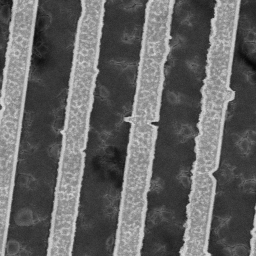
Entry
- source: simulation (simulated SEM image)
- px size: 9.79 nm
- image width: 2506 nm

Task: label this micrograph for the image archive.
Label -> one or a few lines or trenches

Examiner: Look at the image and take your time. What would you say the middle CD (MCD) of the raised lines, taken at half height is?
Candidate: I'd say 22.2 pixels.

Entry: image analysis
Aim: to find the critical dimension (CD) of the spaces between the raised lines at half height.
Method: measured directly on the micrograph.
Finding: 443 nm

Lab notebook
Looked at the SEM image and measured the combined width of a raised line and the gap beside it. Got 66.8 pixels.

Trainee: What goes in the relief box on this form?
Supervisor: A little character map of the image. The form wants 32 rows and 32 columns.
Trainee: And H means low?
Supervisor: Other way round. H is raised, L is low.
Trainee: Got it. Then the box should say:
LLHHHLLLLLHHHLLLLLLHHLLLLLLHHHLL
LLHHLLLLLLHHHLLLLLHHHLLLLLLHHHLL
LLHHLLLLLLHHHLLLLLHHHLLLLLLHHHLL
LHHHLLLLLLHHHLLLLLHHHLLLLLLHHLLL
LHHHLLLLLLHHLLLLLLHHHLLLLLLHHLLL
LHHHLLLLLLHHLLLLLLHHHLLLLLHHHLLL
LHHHLLLLLHHHLLLLLLHHHLLLLLHHHLLL
LHHHLLLLLHHHLLLLLLHHHLLLLLHHHLLL
LHHHLLLLLHHHLLLLLHHHLLLLLLHHHLLL
LHHLLLLLLHHHLLLLLHHHLLLLLLHHHLLL
HHHLLLLLLHHHLLLLLHHHLLLLLLHHLLLL
HHHLLLLLLHHHLLLLLHHHLLLLLHHHHLLL
HHHLLLLLLHHLLLLLLHHHLLLLLHHHHLLL
HHHLLLLLLHHLLLLLLHHHLLLLLHHHLLLL
HHHLLLLLHHHLLLLLHHHHLLLLLHHHLLLL
HHHLLLLLHHHLLLLLHHHLLLLLLHHHLLLL
HHLLLLLLHHHLLLLLHHHLLLLLLHHHLLLL
HHLLLLLLHHHLLLLLHHHLLLLLLHHHLLLL
HHLLLLLLHHLLLLLLHHHLLLLLLHHLLLLL
HHLLLLLLHHLLLLLLHHHLLLLLLHHLLLLL
HHLLLLLLHHLLLLLLHHHLLLLLHHHLLLLL
HHLLLLLHHHLLLLLLHHHLLLLLHHHLLLLL
HHLLLLLHHHLLLLLLHHHLLLLLHHHLLLLL
HHLLLLLHHHLLLLLHHHLLLLLLHHHLLLLL
HLLLLLLHHHLLLLLHHHLLLLLLHHHLLLLL
HLLLLLLHHHLLLLLHHHLLLLLLHHLLLLLL
HLLLLLLHHHLLLLLHHHLLLLLLHHLLLLLL
HLLLLLLHHLLLLLLHHHLLLLLLHHLLLLLL
HLLLLLLHHLLLLLLHHHLLLLLHHHLLLLLL
HLLLLLHHHLLLLLLHHHLLLLLHHHLLLLLL
HLLLLLHHHLLLLLLHHHLLLLLHHHLLLLLL
LLLLLLHHHLLLLLHHHLLLLLLHHHLLLLLH